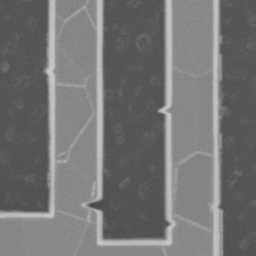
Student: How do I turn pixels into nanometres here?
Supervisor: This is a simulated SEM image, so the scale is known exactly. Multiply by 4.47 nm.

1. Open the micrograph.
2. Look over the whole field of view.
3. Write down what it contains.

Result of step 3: one or a few lines or trenches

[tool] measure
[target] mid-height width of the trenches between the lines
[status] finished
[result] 0.312 um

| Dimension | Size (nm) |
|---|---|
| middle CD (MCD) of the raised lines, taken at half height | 212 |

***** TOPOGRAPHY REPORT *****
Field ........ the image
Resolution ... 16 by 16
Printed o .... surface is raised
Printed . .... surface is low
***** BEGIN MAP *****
...ooo.....oo...
...ooo.....oo...
...ooo.....oo...
...ooo.....oo...
...ooo.....oo...
...ooo.....oo...
...ooo....ooo...
...ooo.....oo...
...ooo.....oo...
...ooo.....oo...
...ooo.....ooo..
...ooo.....ooo..
...ooo.....ooo..
oooooo.....ooo..
oooooo.....ooo..
oooooooooooooo..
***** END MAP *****